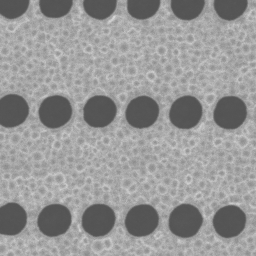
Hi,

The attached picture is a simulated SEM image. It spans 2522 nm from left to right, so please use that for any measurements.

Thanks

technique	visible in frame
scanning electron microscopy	a regular array of holes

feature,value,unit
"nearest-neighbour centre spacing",429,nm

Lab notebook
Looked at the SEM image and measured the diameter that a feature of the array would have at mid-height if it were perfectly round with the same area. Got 0.331 micrometres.